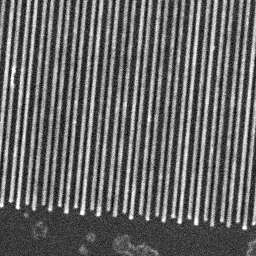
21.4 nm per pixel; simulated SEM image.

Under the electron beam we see parallel lines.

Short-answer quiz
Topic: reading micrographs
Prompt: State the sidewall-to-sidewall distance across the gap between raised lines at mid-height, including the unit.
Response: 128 nm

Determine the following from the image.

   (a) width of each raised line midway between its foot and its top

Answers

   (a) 42.7 nanometres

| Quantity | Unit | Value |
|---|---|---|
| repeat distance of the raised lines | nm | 174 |